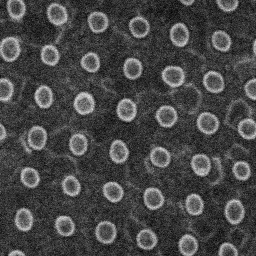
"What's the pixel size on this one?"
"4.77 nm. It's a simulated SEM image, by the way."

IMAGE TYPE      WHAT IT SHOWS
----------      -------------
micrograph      a regular array of raised bodies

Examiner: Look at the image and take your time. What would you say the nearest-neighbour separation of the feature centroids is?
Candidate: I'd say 195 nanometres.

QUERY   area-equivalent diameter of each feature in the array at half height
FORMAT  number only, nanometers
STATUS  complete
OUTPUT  92.4